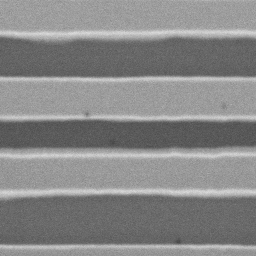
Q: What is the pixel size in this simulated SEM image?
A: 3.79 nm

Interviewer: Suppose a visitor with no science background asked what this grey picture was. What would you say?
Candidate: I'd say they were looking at lines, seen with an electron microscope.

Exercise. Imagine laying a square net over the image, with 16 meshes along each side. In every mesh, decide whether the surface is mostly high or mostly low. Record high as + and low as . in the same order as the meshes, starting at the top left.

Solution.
++++++++++++++++
++++++++++++++++
................
................
................
++++++++++++++++
++++++++++++++++
................
................
..............++
++++++++++++++++
++++++++++++++++
................
................
................
++++++++++++++++